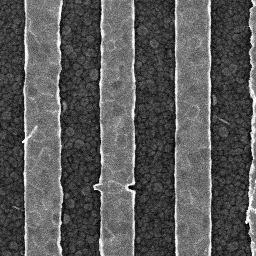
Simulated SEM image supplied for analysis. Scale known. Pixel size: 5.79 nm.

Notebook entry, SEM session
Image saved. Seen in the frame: one or a few lines or trenches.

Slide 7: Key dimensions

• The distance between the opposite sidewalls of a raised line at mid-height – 200 nm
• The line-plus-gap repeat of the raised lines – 75.2 px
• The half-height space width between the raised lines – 0.236 um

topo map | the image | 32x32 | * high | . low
...*****.....****.....****......
...****......****.....****.....*
...****......****.....****.....*
...****......****.....****.....*
...****......****.....****.....*
...****......****.....****.....*
...*****.....****.....****.....*
...*****.....****.....****.....*
...*****.....****.....****.....*
...****......****.....****.....*
...****.....*****.....****.....*
...****......****.....****......
...****.....*****.....****......
...****.....*****.....****......
...****.....*****.....****......
...****......****.....****......
...****......****.....****......
...*****.....****.....****......
...*****.....****.....****.....*
...*****.....****.....****......
...*****.....****.....****......
...*****.....****.....****.....*
...****.....*****.....****.....*
...*****....****......****.....*
...*****.....****.....****.....*
...*****.....****.....****.....*
...*****.....****.....****.....*
...*****.....****.....****.....*
...*****.....****.....****.....*
...*****.....****.....****.....*
...****......****.....****.....*
...*****.....****.....****......